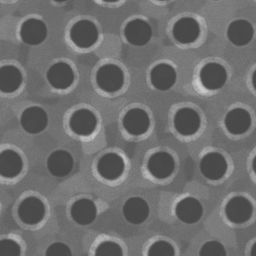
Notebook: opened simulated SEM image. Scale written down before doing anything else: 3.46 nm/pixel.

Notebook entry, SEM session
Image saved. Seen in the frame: a regular array of holes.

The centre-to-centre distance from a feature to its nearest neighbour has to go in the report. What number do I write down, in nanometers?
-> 172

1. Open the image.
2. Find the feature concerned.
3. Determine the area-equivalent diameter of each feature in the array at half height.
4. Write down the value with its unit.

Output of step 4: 93.6 nm